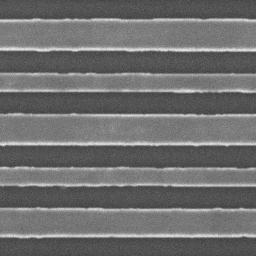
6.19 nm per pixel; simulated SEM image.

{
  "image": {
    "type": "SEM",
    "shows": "lines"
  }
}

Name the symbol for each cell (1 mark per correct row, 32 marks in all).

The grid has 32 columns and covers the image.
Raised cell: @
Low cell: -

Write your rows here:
--------------------------------
--------------------------------
---------@-@@@@----@@@@@@---@@@-
@@@@@@@@@@@@@@@@@@@@@@@@@@@@@@@@
@@@@@@@@@@@@@@@@@@@@@@@@@@@@@@@@
@@@@@@@@@@@@@@@@@@@@@@@@@@@@@@@@
--------------------------------
--------------------------------
--------------------------------
@@@@@@@@@@@@@@@@@@@@@@@@@@@@@@@@
@@@@@@@@@@@@@@@@@@@@@@@@@@@@@@@@
--------------------------------
--------------------------------
--------------------------------
@@@@@@@@@@@@@@@@@@@@@@@@@@@@@@@@
@@@@@@@@@@@@@@@@@@@@@@@@@@@@@@@@
@@@@@@@@@@@@@@@@@@@@@@@@@@@@@@@@
@@@@@@@@@@@@@@@@@@@@@@@@@@@@@@@@
--------------------------------
--------------------------------
--------------------------------
@@@@@@@@@@@@@@@@@@@@@@@@@@@@@@@@
@@@@@@@@@@@@@@@@@@@@@@@@@@@@@@@@
--------------------------------
--------------------------------
--------------------------------
@@@@@@@@@@@@@@@@@@@@@@@@@@@@@@@@
@@@@@@@@@@@@@@@@@@@@@@@@@@@@@@@@
@@@@@@@@@@@@@@@@@@@@@@@@@@@@@@@@
@@@@@@@@@@@-@-@@@@@@@@@@@@@@@@-@
--------------------------------
--------------------------------